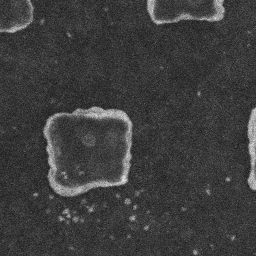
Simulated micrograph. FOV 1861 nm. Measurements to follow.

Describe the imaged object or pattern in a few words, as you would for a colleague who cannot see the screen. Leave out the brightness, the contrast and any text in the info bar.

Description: raised bodies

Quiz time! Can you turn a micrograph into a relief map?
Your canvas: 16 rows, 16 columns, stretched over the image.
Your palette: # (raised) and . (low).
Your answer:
##.......#####..
##..............
................
................
................
................
................
...#####........
...#####........
...#####........
...#####........
....###.........
................
................
................
................